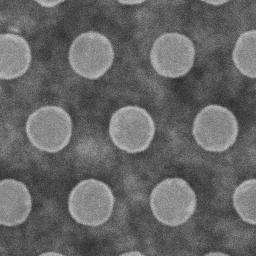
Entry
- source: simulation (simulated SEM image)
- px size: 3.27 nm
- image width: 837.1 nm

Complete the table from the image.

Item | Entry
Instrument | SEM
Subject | raised bodies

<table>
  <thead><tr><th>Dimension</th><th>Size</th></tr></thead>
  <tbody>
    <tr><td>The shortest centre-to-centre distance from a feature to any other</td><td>268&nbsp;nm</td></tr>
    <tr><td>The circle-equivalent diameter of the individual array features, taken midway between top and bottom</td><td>146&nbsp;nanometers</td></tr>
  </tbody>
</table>